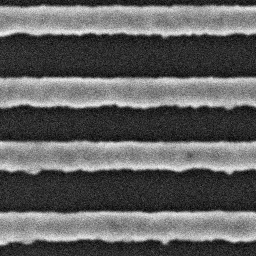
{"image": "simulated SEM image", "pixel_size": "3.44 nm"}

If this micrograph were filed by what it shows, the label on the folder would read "lines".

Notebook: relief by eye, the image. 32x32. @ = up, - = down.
--------------------------------
@@@@@@@@@@@@@@@@@@@@@@@@@@@@@@@@
@@@@@@@@@@@@@@@@@@@@@@@@@@@@@@@@
@@@@@@@@@@@@@@@@@@@@@@@@@@@@@@@@
--------------------------------
--------------------------------
--------------------------------
--------------------------------
--------------------------------
--------------------------------
@@@@@@@@@@@@@@@@@@@@@@@@@@@@@@@@
@@@@@@@@@@@@@@@@@@@@@@@@@@@@@@@@
@@@@@@@@@@@@@@@@@@@@@@@@@@@@@@@@
--------------------------------
--------------------------------
--------------------------------
--------------------------------
--------------------------------
@@@@@@@@@@@@@@@@@@@@@@@@@@@@@@@@
@@@@@@@@@@@@@@@@@@@@@@@@@@@@@@@@
@@@@@@@@@@@@@@@@@@@@@@@@@@@@@@@@
----@-----------------------@---
--------------------------------
--------------------------------
--------------------------------
--------------------------------
--------------------------------
@@@@@@@@@@@@@@@@@@@@@@@@@@@@@@@@
@@@@@@@@@@@@@@@@@@@@@@@@@@@@@@@@
@@@@@@@@@@@@@@@@@@@@@@@@@@@@@@@@
--------------------------------
--------------------------------